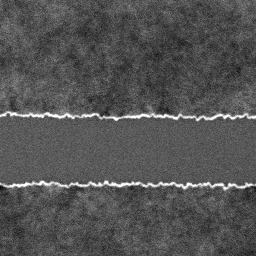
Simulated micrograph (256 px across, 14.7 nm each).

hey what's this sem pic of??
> one or a few lines or trenches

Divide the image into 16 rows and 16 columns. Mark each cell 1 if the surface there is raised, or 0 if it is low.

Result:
1111111111111111
1111111111111111
1111111111111111
1111111111111111
1111111111111111
1111111111111111
1111111111111111
0000000000000000
0000000000000000
0000000000000000
0000000000000000
0011000010100000
1111111111111111
1111111111111111
1111111111111111
1111111111111111